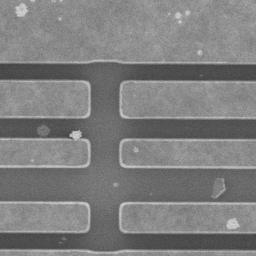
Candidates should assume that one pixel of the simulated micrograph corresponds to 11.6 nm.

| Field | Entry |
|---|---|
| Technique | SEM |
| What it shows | groups of lines, slits or small figures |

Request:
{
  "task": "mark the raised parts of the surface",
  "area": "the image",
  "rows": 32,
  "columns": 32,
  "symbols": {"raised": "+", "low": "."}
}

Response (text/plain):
++++++++++++++++++++++++++++++++
++++++++++++++++++++++++++++++++
++++++++++++++++++++++++++++++++
++++++++++++++++++++++++++++++++
++++++++++++++++++++++++++++++++
++++++++++++++++++++++++++++++++
++++++++++++++++++++++++++++++++
++++++++++++++++++++++++++++++++
................................
................................
+++++++++++....+++++++++++++++++
+++++++++++....+++++++++++++++++
+++++++++++....+++++++++++++++++
+++++++++++....+++++++++++++++++
+++++++++++....+++++++++++++++++
................................
.........+......................
+++++++++++.....+++++++++++++++.
+++++++++++....+++++++++++++++++
+++++++++++....+++++++++++++++++
+++++++++++....+++++++++++++++++
................................
................................
................................
................................
+++++++++++....+++++++++++++++++
+++++++++++....+++++++++++++++++
+++++++++++....+++++++++++++++++
+++++++++++....+++++++++++++++++
................................
................................
++++++++++++...+++++++++++++++++